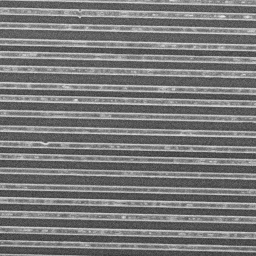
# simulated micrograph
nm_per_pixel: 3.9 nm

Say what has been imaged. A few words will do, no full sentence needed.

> parallel lines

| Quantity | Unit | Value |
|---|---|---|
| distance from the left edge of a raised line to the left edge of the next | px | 14.5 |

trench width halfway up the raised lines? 32.2 nanometres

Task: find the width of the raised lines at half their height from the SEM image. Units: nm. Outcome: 24.9